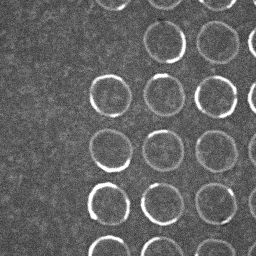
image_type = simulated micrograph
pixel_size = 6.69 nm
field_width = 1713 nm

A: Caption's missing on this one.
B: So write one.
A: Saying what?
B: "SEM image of a regular array of raised bodies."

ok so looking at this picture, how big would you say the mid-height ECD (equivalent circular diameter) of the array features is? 41.5 px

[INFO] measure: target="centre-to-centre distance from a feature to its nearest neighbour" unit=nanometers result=350